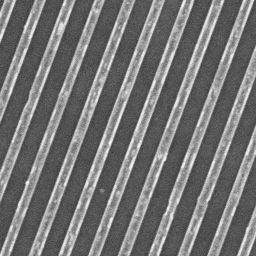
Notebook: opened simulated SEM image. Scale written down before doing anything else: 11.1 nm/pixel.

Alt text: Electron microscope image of parallel lines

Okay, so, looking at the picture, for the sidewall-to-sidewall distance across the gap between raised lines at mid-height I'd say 0.203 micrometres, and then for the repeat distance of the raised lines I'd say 0.31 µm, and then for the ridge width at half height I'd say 112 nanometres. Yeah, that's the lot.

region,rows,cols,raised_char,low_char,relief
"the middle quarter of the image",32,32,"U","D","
DDUUDDDDDUUUDDDDUUUDDDDDUUUDDDDU
DUUUDDDDDUUDDDDDUUUDDDDUUUDDDDDU
DUUDDDDDUUUDDDDDUUDDDDDUUUDDDDUU
UUUDDDDDUUDDDDDUUUDDDDDUUDDDDDUU
UUUDDDDUUUDDDDDUUDDDDDUUUDDDDDUU
UUDDDDDUUUDDDDUUUDDDDDUUUDDDDUUU
UUDDDDDUUDDDDDUUUDDDDDUUDDDDDUUU
UDDDDDUUUDDDDDUUDDDDDUUUDDDDDUUD
UDDDDDUUUDDDDUUUDDDDDUUUDDDDUUUD
UDDDDDUUDDDDDUUUDDDDDUUDDDDDUUUD
DDDDDUUUDDDDDUUDDDDDUUUDDDDUUUDD
DDDDDUUDDDDDUUUDDDDDUUDDDDDUUUDD
DDDDUUUDDDDDUUDDDDDUUUDDDDDUUDDD
DDDDUUUDDDDUUUDDDDDUUUDDDDUUUDDD
DDDDUUDDDDDUUUDDDDDUUDDDDDUUUDDD
DDDUUUDDDDDUUDDDDDUUUDDDDDUUDDDD
DDDUUUDDDDUUUDDDDDUUUDDDDUUUDDDD
DDDUUDDDDDUUUDDDDDUUDDDDDUUUDDDD
DDUUUDDDDDUUDDDDDUUUDDDDUUUDDDDD
DDUUUDDDDUUUDDDDDUUDDDDDUUUDDDDD
DUUUDDDDDUUDDDDDUUUDDDDDUUDDDDDU
DUUUDDDDDUUDDDDDUUUDDDDUUUDDDDDU
DUUDDDDDUUUDDDDDUUDDDDDUUUDDDDDU
UUUDDDDDUUDDDDDUUUDDDDDUUUDDDDUU
UUUDDDDDUUDDDDDUUUDDDDUUUDDDDDUU
UUDDDDDUUUDDDDDUUDDDDDUUUDDDDUUU
UUDDDDDUUDDDDDUUUDDDDDUUDDDDDUUU
UUDDDDUUUDDDDDUUDDDDDUUUDDDDDUUD
UDDDDDUUUDDDDUUUDDDDDUUDDDDDUUUD
UDDDDDUUDDDDDUUUDDDDUUUDDDDDUUDD
DDDDDUUUDDDDDUUDDDDDUUUDDDDDUUDD
DDDDDUUDDDDDUUUDDDDDUUDDDDDUUUDD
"